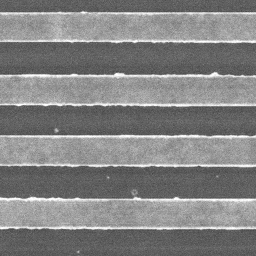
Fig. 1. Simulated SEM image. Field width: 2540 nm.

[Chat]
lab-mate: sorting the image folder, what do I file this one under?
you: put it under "lines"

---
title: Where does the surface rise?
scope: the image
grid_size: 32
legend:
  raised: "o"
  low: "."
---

................................
................................
oooooooooooooooooooooooooooooooo
oooooooooooooooooooooooooooooooo
oooooooooooooooooooooooooooooooo
................................
................................
................................
................................
ooooooooooooooooooooooooooooo...
oooooooooooooooooooooooooooooooo
oooooooooooooooooooooooooooooooo
oooooooooooooooooooooooooooooooo
................................
................................
................................
................................
oooooooooooooooooooooooooooooooo
oooooooooooooooooooooooooooooooo
oooooooooooooooooooooooooooooooo
oooooooooooooooooooooooooooooooo
................................
................................
................................
................................
oooooooooooooooooooooooooooooooo
oooooooooooooooooooooooooooooooo
oooooooooooooooooooooooooooooooo
o.ooo.oooo.ooooooooooooooooooooo
................................
................................
................................